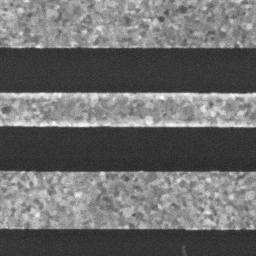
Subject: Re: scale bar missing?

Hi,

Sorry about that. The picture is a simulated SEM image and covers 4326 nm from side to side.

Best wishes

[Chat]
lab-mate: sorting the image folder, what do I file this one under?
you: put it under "lines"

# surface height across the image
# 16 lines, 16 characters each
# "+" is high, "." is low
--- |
++++++++++++++++
++++++++++++++++
++++++++++++++++
................
................
................
++++++++++++++++
++++++++++++++++
................
................
................
++++++++++++++++
++++++++++++++++
++++++++++++++++
................
................